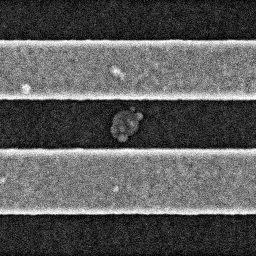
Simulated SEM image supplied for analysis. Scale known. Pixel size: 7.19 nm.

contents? lines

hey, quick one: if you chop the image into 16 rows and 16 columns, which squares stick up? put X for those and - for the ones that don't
----------------
----------------
----------------
XXXXXXXXXXXXXXXX
XXXXXXXXXXXXXXXX
XXXXXXXXXXXXXXXX
----------------
----------------
----------------
XXXXXXXXXXXXXXXX
XXXXXXXXXXXXXXXX
XXXXXXXXXXXXXXXX
XXXXXXXXXXXXXXXX
----------------
----------------
----------------